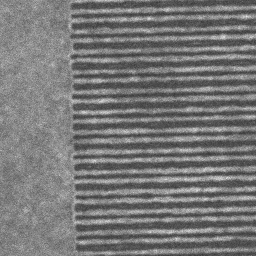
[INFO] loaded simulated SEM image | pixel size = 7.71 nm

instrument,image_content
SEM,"parallel lines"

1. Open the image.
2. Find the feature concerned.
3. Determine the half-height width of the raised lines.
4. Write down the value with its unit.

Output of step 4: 29.9 nanometres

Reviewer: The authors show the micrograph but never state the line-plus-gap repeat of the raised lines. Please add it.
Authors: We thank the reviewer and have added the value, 10.1 pixels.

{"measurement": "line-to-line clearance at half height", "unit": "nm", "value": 52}